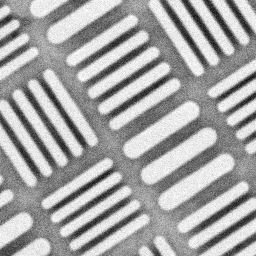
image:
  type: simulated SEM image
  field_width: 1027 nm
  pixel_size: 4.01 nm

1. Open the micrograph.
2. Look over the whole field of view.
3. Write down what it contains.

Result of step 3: groups of lines, slits or small figures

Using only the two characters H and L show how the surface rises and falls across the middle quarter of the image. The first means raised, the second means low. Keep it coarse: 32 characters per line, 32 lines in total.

LLLLLLHHHHHLLLLHHHHHLLLLHHLLLLLH
LLLLLHHHHHLLLHHHHHLLLLHHHHLLLLLL
LLLLHHHHLLLLHHHHHLLLLHHHHLLLLLLL
LLLLHHLLLLHHHHHLLLLHHHHHLLLLLLLL
LLLLLLLLLHHHHHLLLHHHHHHLLLHHHLLL
LLLLLLLLHHHHLLLLHHHHHLLLLHHHHLLL
LLLLLLHHHHLLLLHHHHHLLLLHHHHHLLLL
HLLLLLHHHLLLLHHHHHLLLHHHHHHLLLLL
HHLLLLLLLLLLHHHHLLLLHHHHHLLLLLLL
HHLLLLLLLLHHHHHLLLLHHHHHLLLLLLLL
HHHLLLLLLHHHHLLLLHHHHHLLLLLLLHHH
HHHHLLLLLHHHLLLLHHHHLLLLLLLLHHHH
LHHHLLLLLLLLLLHHHHHLLLLLLLLHHHHH
LLHHHLLLLLLLLHHHHLLLLLLLLHHHHHHH
LLHHHHLLLLLLHHHHLLLLLLLHHHHHHHHL
HLLHHHLLLLLLHHLLLLLLLLHHHHHHHHLL
HLLLHHHLLLLLLLLLLLLLLHHHHHHHLLLL
HHLLLHHLLLLLLLLLLLLHHHHHHHHLLLLL
HHHLLHHHLLLLLLLLLHHHHHHHHLLLLLLL
HHHLLLHHLLLLLLLLHHHHHHHHLLLLLLHH
LHHHLLLLLLLLLLLHHHHHHHLLLLLLLHHH
LLHHLLLLLLLLLLLHHHHHHLLLLLLHHHHH
LLHHLLLLLLLLLLLLHHHLLLLLLHHHHHHH
LLLLLLLLLLLLLLLLLLLLLLLLHHHHHHHH
HLLLLLLLLHHHLLLLLLLLLLLHHHHHHHLL
LLLLLLLLHHHHLLLLLLLLLHHHHHHHHLLL
LLLLLLHHHHLLLLLLLLLLHHHHHHHLLLLL
LLLLLHHHHLLLHHLLLLLLHHHHHHLLLLLL
LLLHHHHHLLLHHHLLLLLLHHHHHLLLLLLH
LLHHHHLLLHHHHLLLLLLLLHHLLLLLLHHH
HHHHLLLLHHHHLLLLLLLLLLLLLLLLHHHH
HHHLLLHHHHLLLLHHHLLLLLLLLLHHHHHH